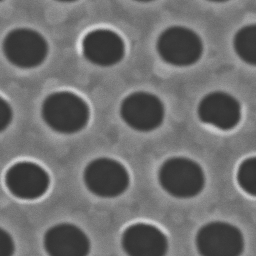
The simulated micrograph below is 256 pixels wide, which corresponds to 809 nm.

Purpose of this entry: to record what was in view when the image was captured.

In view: a regular array of holes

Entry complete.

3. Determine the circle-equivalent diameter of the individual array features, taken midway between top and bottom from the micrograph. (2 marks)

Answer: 0.132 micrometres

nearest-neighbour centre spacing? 238 nanometres